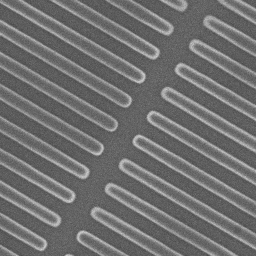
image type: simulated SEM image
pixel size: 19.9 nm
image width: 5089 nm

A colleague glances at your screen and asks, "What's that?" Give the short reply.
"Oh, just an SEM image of groups of lines, slits or small figures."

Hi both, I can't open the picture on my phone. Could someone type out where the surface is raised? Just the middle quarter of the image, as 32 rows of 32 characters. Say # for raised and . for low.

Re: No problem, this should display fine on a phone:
####.......######............##.
#####........######.........####
.######.......######.........###
..#######.......####..........##
....######........#.............
......######....................
........######...........##.....
##.......######..........####...
####.......######........######.
#####........####..........#####
.######........#.............###
..#######.....................##
....######...........###........
......######.........#####......
.......######.........#####.....
##.......####..........######...
####.......##............######.
#####.....................######
#######...........##........####
..#######.........####........##
....######........######.......#
......####..........######......
........#............######.....
#......................######...
###...........###........######.
#####.........####........######
.#####.........#####........####
...###..........######........##
..................######.......#
....................######......
...........##........######.....
#..........####........######...